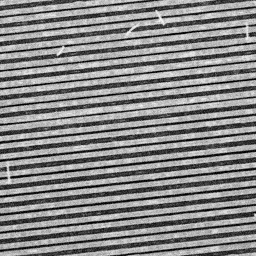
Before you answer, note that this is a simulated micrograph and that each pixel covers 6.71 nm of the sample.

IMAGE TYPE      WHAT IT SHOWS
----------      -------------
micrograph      parallel lines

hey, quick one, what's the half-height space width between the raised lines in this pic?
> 0.0292 microns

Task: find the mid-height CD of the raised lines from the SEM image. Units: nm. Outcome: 34.2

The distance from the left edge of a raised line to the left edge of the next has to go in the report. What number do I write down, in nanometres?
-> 59.8